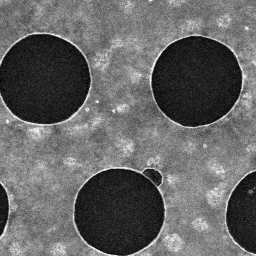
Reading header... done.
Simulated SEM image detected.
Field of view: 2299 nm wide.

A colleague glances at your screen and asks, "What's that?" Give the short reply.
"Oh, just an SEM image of holes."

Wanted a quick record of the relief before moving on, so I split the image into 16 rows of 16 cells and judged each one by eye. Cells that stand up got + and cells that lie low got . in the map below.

++++++++++++++++
++++++++++++++++
+...+++++++..+++
.....+++++.....+
......++++.....+
......+++......+
.....+++++.....+
+...+++++++...++
++++++++++++++++
++++++++++++++++
++++++++++++++++
+++++.....+++++.
+++++.....++++..
+++++.....++++..
+++++.....++++..
++++++...++++++.